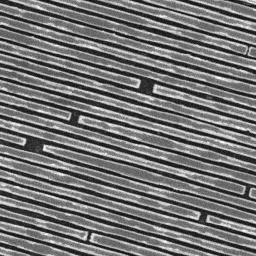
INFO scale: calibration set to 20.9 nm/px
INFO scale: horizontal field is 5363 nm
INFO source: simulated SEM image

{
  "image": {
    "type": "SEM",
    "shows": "parallel lines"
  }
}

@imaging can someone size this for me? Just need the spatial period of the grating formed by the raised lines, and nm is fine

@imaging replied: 258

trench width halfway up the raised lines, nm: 111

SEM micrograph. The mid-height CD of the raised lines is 149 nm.